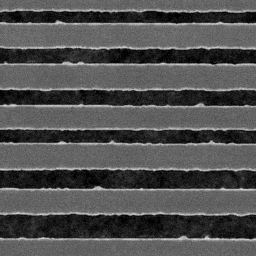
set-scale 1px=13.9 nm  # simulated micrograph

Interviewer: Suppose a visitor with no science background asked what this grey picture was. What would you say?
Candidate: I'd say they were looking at lines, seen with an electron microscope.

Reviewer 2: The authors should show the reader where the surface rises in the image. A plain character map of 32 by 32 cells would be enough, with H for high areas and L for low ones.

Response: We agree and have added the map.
HHHHHHHHHHHHHHHHHHHHHHHHHHHHHHHH
LLLLLLLLLLLLLLLLLLLLLLLLLLLLLLLL
LLLLLLLLLLLLLLLLLLLLLLLLLLLLLLLL
HHHHHHHHHHHHHHHHHHHHHHHHHHHHHHHH
HHHHHHHHHHHHHHHHHHHHHHHHHHHHHHHH
HHHHHHHHHHHHHHHHHHHHHHHHHHHHHHHH
LLLLLLLLLLLLLLLLLLLLLLLLLLLLLLLL
LLLLLLLLLLLLLLLLLLLLLLLLLLLLLLLL
HHHHHHHHHHHHHHHHHHHHHHHHHHHHHHHH
HHHHHHHHHHHHHHHHHHHHHHHHHHHHHHHH
HHHHHHHHHHHHHHHHHHHHHHHHHHHHHHHH
LLLLLLLLLLLLLLLLLLLLLLLLLLLLLLLL
LLLLLLLLLLLLLLLLLLLLLLLLLLLLLLLL
HHHHHHHHHHHHHHHHHHHHHHHHHHHHHHHH
HHHHHHHHHHHHHHHHHHHHHHHHHHHHHHHH
HHHHHHHHHHHHHHHHHHHHHHHHHHHHHHHH
LLLLLLLLLLLLLLLLLLLLLLLLLLLLLLLL
LLLLLLLLLLLLLLLLLLLLLLLLLLLLLLLL
HHHHHHHHHHHHHHHHHHHHHHHHHHHHHHHH
HHHHHHHHHHHHHHHHHHHHHHHHHHHHHHHH
HHHHHHHHHHHHHHHHHHHHHHHHHHHHHHHH
LLLLLLLLLLLLLLLLLLLLLLLLLLLLLLLL
LLLLLLLLLLLLLLLLLLLLLLLLLLLLLLLL
LLLLLLLLLLLLLLLLLLLLLLLLLLLLLLLL
HHHHHHHHHHHHHHHHHHHHHHHHHHHHHHHH
HHHHHHHHHHHHHHHHHHHHHHHHHHHHHHHH
HHHHHHHHHHHHHHHHHHHHHHHHHHHHHHHH
LLLLLLLLLLLLLLLLLLLLLLLLLLLLLLLL
LLLLLLLLLLLLLLLLLLLLLLLLLLLLLLLL
LLLLLLLLLLLLLLLLLLLLLLLLLLLLLLLL
HHHHHHHHHHHHHHHHHHHHHHHHHHHHHHHH
HHHHHHHHHHHHHHHHHHHHHHHHHHHHHHHH